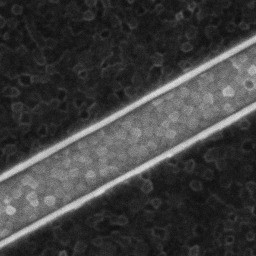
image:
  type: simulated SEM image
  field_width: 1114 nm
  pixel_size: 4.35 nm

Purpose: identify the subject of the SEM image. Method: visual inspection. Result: one or a few lines or trenches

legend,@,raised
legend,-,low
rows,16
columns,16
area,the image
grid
@@@@@@@@@@@@@@@@
@@@@@@@@@@@@@@@@
@@@@@@@@@@@@@@@@
@@@@@@@@@@@@@@--
@@@@@@@@@@@@----
@@@@@@@@@@------
@@@@@@@@@-------
@@@@@@@-------@@
@@@@@-------@@@@
@@@--------@@@@@
@--------@@@@@@@
-------@@@@@@@@@
-----@@@@@@@@@@@
---@@@@@@@@@@@@@
-@@@@@@@@@@@@@@@
@@@@@@@@@@@@@@@@